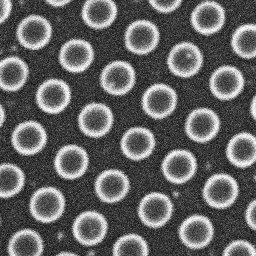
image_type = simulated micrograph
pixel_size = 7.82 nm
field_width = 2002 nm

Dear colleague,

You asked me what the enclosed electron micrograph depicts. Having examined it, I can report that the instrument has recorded a regular array of raised bodies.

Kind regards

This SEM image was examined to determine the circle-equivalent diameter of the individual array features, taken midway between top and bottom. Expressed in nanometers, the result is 244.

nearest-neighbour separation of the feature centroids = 369 nm